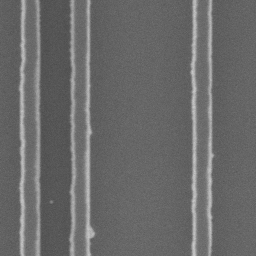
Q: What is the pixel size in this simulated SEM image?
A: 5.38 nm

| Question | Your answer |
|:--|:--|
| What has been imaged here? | lines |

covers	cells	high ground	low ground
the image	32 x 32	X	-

---XX----XX-------------XX------
---XX----XX-------------XX------
---XX----XX-------------XX------
---XX----XX-------------XX------
---XX----XX-------------XX------
---XX----XX-------------XX------
---XX----XX-------------XX------
---XX----XX-------------XX------
---XX----XX-------------XX------
---XX----XX-------------XX------
---XX----XX-------------XX------
---XX----XX-------------XX------
---XX----XX-------------XX------
---XX----XX-------------XX------
---XX----XX-------------XX------
---XX----XX-------------XX------
---XX----XX-------------XX------
---XX----XX-------------XX------
---XX----XX-------------XX------
---XX----XX-------------XX------
---XX----XX-------------XX------
---XX----XX-------------XX------
---XX----XX-------------XX------
---XX----XX-------------XX------
---XX----XX-------------XX------
---XX----XX-------------XX------
---XX----XX-------------XX------
---XX----XX-------------XX------
---XX----XX-------------XX------
---XX----XX-------------XX------
---XX----XX-------------XX------
---XX----XX-------------XX------